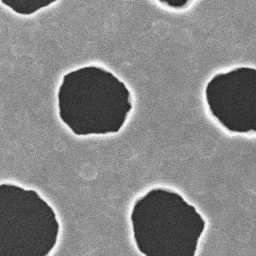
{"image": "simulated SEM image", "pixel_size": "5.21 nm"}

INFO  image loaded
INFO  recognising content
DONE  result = holes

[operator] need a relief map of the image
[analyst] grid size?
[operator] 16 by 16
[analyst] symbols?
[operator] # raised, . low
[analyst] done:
#..#############
################
################
################
####...#######..
####....#####...
####....#####...
####....######..
################
################
################
.###############
...######...####
...#####.....###
....####.....###
...######...####